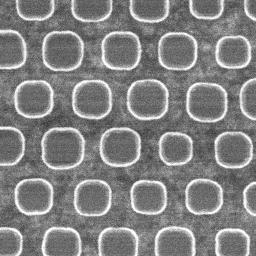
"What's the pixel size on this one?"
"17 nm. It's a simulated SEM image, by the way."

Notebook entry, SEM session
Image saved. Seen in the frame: a regular array of raised bodies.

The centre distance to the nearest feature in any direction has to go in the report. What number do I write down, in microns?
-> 0.947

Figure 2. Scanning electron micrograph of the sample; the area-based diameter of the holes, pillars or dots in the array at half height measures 0.651 micrometres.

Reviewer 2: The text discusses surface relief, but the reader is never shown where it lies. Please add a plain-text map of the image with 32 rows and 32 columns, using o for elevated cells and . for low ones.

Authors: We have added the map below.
..ooooo..ooooo..ooooo...oooo...o
..oooo...ooooo..ooooo...oooo...o
..........ooo.....oo............
................................
ooo...oooo...oooo....ooo........
ooo...oooo...oooo...oooo...oooo.
ooo...oooo...ooooo..oooo...oooo.
ooo...oooo...oooo...oooo...oooo.
......ooo.....oo.....ooo........
................................
...ooo....ooo....ooo.....oo....o
..oooo...ooooo..ooooo...oooo..oo
..oooo...ooooo..ooooo...oooo..oo
..oooo...ooooo..ooooo...oooo..oo
...oo.....ooo....ooo....oooo...o
................................
oo....oooo...oooo...............
ooo..ooooo...oooo...oooo...oooo.
ooo..ooooo...oooo...oooo...oooo.
ooo..ooooo...oooo...oooo...oooo.
o.....oooo....oo.....o......ooo.
................................
.........................o......
..oooo....oooo...oooo..ooooo...o
..oooo...ooooo..ooooo..ooooo...o
..oooo...ooooo...oooo..ooooo...o
...ooo....ooo....ooo....ooo....o
................................
o...............................
ooo...oooo...oooo...oooo...oooo.
ooo..ooooo...oooo...oooo...oooo.
oo...ooooo...oooo...oooo...oooo.